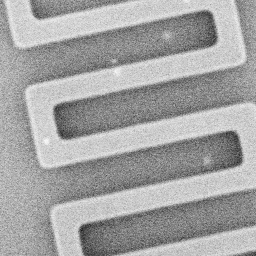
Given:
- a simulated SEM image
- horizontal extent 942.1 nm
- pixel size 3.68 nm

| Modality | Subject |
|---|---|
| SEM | groups of lines, slits or small figures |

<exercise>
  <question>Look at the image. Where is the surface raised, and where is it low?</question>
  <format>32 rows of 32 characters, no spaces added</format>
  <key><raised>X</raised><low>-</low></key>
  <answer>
-XXX-----------XXXXXXXXXXXXXX---
-XXX------XXXXXXXXXXXXXX--XXXX--
-XXXXXXXXXXXXXXXXXX--------XXX--
-XXXXXXXXXXXXXX------------XXX--
--XXXXXXXX-----------------XXX--
--XXX----------------------XXX--
------------------------XXXXXXX-
-------------------XXXXXXXXXXX--
---------------XXXXXXXXXXXXX----
----------XXXXXXXXXXXXX---------
-----XXXXXXXXXXXXXX-------------
---XXXXXXXXXXX------------------
---XXXXXX-----------------------
----XXX---------------------XXXX
----XXX----------------XXXXXXXXX
----XXX------------XXXXXXXXXXXXX
----XXX-------XXXXXXXXXXXXX--XXX
----XXXX-XXXXXXXXXXXXX--------XX
-----XXXXXXXXXXXXX------------XX
-----XXXXXXXX-----------------XX
-----XXX----------------------XX
---------------------------XXXXX
-----------------------XXXXXXXXX
------------------XXXXXXXXXXXXXX
-------------XXXXXXXXXXXXX------
--------XXXXXXXXXXXXXX----------
------XXXXXXXXXXX---------------
------XXXXXX--------------------
-------XXX---------------------X
-------XXX----------------XXXXXX
-------XXX------------XXXXXXXXXX
-------XXX-------XXXXXXXXXXXXX--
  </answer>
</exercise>